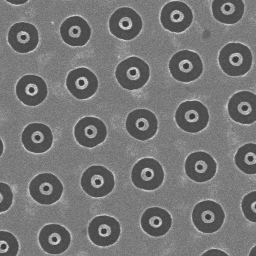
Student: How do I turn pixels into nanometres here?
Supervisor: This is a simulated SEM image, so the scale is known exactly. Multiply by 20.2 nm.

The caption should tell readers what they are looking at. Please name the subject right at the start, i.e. a regular array of ring-shaped grooves with a dot in the middle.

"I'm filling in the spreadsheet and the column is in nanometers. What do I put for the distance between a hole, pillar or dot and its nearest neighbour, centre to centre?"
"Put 1010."